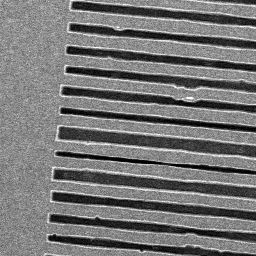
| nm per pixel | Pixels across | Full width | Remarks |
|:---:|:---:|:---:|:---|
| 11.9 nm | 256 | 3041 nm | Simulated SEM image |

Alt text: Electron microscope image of parallel lines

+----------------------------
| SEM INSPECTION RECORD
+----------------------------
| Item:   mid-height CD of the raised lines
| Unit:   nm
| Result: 151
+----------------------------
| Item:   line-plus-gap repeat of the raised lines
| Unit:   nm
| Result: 253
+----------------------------